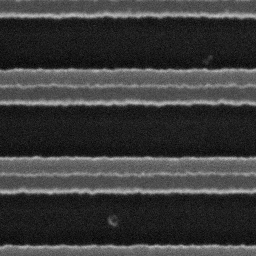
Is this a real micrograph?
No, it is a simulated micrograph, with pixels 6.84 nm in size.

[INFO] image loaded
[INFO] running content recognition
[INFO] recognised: lines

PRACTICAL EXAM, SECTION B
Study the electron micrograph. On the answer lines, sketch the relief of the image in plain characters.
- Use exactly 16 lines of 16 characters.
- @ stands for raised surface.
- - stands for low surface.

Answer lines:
@@@@@@@@@@@@@@@@
----------------
----------------
----------------
@@@@@@@@@@@@@@@@
@@@@@@@@@@@@@@@@
----------------
----------------
----------------
----------------
@@@@@@@@@@@@@@@@
@@@@@@@@@@@@@@@@
----------------
----------------
----------------
@@@@@@@@@@@@@@@@